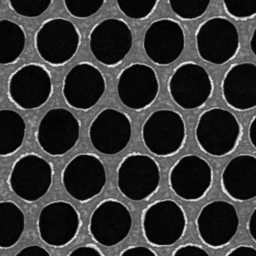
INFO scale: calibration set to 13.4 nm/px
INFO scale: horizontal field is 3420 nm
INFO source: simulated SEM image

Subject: a regular array of holes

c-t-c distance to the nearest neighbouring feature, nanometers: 699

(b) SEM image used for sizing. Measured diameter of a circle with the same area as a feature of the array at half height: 571 nm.